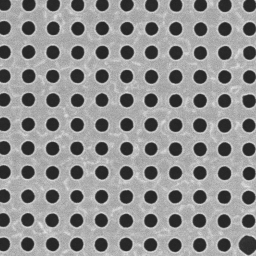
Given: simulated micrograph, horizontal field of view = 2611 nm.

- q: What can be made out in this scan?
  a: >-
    a regular array of holes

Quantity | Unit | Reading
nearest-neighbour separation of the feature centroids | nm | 242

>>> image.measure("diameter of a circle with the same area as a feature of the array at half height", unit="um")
0.141